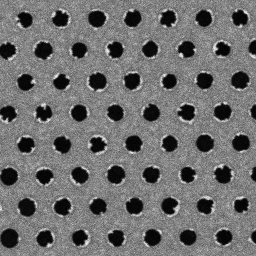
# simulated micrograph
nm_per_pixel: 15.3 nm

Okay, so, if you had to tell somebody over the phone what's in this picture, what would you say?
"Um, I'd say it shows a regular array of holes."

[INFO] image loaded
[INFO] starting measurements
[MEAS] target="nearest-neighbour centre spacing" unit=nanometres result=541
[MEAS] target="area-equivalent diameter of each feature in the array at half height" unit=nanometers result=252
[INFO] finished